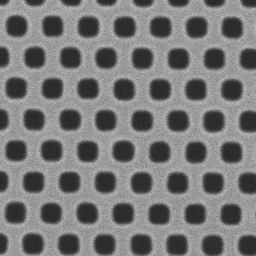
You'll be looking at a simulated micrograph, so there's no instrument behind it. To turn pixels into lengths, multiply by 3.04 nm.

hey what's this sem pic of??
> a regular array of holes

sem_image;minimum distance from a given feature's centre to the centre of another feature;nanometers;108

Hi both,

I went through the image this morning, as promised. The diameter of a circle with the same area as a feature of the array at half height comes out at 66.8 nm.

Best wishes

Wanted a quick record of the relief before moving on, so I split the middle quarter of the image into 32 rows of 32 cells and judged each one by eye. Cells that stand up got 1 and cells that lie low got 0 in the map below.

00011111000001111000001111000001
11111111111111111111111111111111
11111111111111111111111111111111
11111001111111111111111111111111
11110000111110000111110000111110
11100000011100000011100000011100
11100000011100000011100000011100
11100000011110000011110000011100
11110000111110000111110000111110
11111111111111111111111111111111
11111111111111111111111111111111
00111111110111111110111111110111
00001111000001111000001111000001
00001111000001111000001111000001
00001111000001111000001111000001
00001111000001111000001111000001
00011111100011111100001111100011
11111111111111111111111111111111
11111111111111111111111111111111
11110001111110000111111001111111
11100000111100000111110000111110
11100000111100000011100000011110
11110000111100000011100000011110
11110000111100000111100000111110
11111001111111001111110001111111
11111111111111111111111111111111
11111111111111111111111111111111
00001111000011111100011111100011
00001111000001111000001111000001
00001111000001111000001111000001
00001111000001111000001111000001
00011111000011111000001111000001